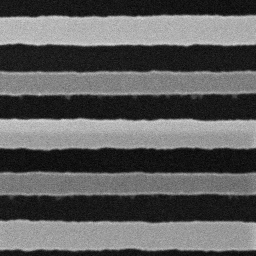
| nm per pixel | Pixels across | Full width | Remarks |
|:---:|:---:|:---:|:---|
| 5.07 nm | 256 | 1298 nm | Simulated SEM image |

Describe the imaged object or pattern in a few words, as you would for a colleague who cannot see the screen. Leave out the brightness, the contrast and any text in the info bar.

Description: lines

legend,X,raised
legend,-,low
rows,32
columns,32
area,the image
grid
--------------------------------
--------------------------------
XXXXXXXXXXXXXXXXXXXXXXXXXXXXXXXX
XXXXXXXXXXXXXXXXXXXXXXXXXXXXXXXX
XXXXXXXXXXXXXXXXXXXXXXXXXXXXXXXX
XX-XXXXXXXXXXXXXXXXXXXXXXXXXXXXX
--------------------------------
--------------------------------
--------------------------------
XXXXXXXXXXXXXXXXXXXXXXXXXXXXXXXX
XXXXXXXXXXXXXXXXXXXXXXXXXXXXXXXX
XXXXXXXXXXXXXXXXXXXXXXXXXXXXXXXX
--------------------------------
--------------------------------
--------------------------------
XXXXXXXXXXXXXXXXXXXXXXXXXXXXXXXX
XXXXXXXXXXXXXXXXXXXXXXXXXXXXXXXX
XXXXXXXXXXXXXXXXXXXXXXXXXXXXXXXX
XXXXXXXXXXXXX-XXX-XXXX---XX-XXXX
--------------------------------
--------------------------------
----X---------------------------
XXXXXXXXXXXXXXXXXXXXXXXXXXXXXXXX
XXXXXXXXXXXXXXXXXXXXXXXXXXXXXXXX
--------------------------------
--------------------------------
--------------------------------
--X-----------------------------
XXXXXXXXXXXXXXXXXXXXXXXXXXXXXXXX
XXXXXXXXXXXXXXXXXXXXXXXXXXXXXXXX
XXXXXXXXXXXXXXXXXXXXXXXXXXXXXXXX
--------------------------------